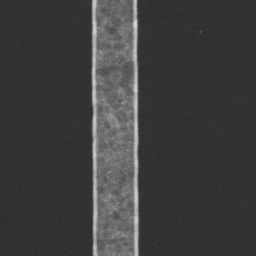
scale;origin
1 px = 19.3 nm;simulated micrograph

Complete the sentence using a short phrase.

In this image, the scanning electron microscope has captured wiring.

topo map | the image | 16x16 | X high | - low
------XX--------
------XX--------
------XX--------
------XX--------
------XX--------
------XX--------
------XX--------
------XX--------
------XX--------
------XX--------
------XX--------
------XX--------
------XX--------
------XX--------
------XX--------
------XX--------